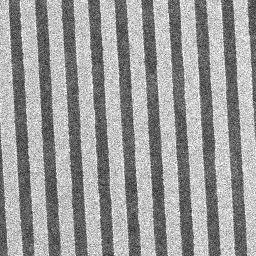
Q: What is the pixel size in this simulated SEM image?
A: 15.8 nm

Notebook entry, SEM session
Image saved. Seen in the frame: parallel lines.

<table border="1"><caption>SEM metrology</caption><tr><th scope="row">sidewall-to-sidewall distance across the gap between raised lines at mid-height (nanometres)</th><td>201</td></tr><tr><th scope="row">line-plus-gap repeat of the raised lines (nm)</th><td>420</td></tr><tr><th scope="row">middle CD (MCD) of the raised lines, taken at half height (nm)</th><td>217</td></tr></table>